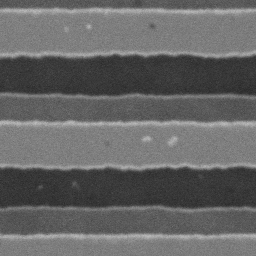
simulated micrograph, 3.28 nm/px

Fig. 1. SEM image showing lines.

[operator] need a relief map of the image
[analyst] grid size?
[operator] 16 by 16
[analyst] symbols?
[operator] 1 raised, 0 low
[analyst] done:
1111111111111111
1111111111111111
1111111111111111
0000000000000100
0000000000000000
0000000000000000
1111111111111111
1111111111111111
1111111111111111
1111111111111111
0001110010000000
0000000000000000
0000000000000000
1111111111111111
1111111111111111
1111111111111111